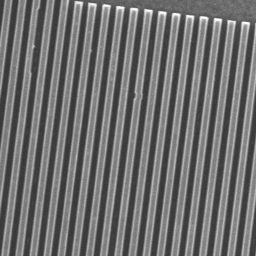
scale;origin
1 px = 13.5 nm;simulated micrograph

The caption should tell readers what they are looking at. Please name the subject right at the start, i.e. parallel lines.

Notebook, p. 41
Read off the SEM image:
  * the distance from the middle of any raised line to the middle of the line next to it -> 189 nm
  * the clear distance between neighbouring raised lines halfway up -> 87.2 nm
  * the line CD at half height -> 99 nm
